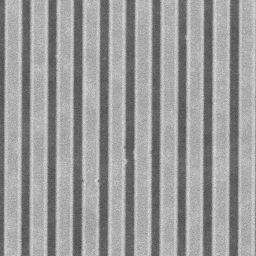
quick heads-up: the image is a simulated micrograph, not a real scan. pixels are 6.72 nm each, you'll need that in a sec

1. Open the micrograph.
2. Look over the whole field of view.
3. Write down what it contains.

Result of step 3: parallel lines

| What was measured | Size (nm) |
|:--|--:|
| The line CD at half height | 91.6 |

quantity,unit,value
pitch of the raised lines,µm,0.175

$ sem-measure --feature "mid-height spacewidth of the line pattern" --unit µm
0.0798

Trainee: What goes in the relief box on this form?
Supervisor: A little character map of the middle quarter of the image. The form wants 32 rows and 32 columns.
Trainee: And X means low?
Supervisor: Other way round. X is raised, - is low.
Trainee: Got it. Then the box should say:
XX---XXX----XXX---XXX----XXX---X
XX---XXX----XXX---XXX----XXX---X
XX---XXX----XXX---XXX----XXX---X
XX---XXX----XXX---XXX----XXX---X
XX---XXX----XXX---XXX----XXX---X
XX---XXX----XXX---XXXX---XXX---X
XX---XXX----XXX---XXX----XXX---X
XX---XXX----XXX---XXX----XXX---X
XX---XXX----XXX---XXX----XXX---X
XX---XXX----XXX---XXX----XXX---X
XX---XXX----XXX---XXX----XXX---X
XX---XXX----XXX---XXX----XXX---X
XX---XXX----XXX---XXX----XXX---X
XX---XXX----XXX---XXX----XXX---X
XX---XXX----XXX---XXX----XXX---X
XX---XXX----XXX---XXX----XXX---X
XX---XXX----XXX---XXX----XXX---X
XX---XXX----XXX---XXX----XXX---X
XX---XXX----XXX---XXX----XXX---X
XX---XXX----XXX---XXX----XXX---X
XX---XXX----XXX---XXX----XXX---X
XX---XXX----XXX---XXX----XXX---X
XX---XXX----XXX---XXX----XXX---X
XX---XXX----XXX---XXX----XXX---X
XX---XXX----XXX---XXX----XXX---X
XX---XXX----XXX---XXX----XXX---X
XX---XXX----XXX---XXX----XXX---X
XX---XXX----XXX---XXX----XXX---X
XX---XXX----XXX---XXX----XXX---X
XX---XXX----XXX---XXX----XXX---X
XX---XXX----XXX---XXX----XXX---X
XX---XXX----XXX---XXX----XXX---X